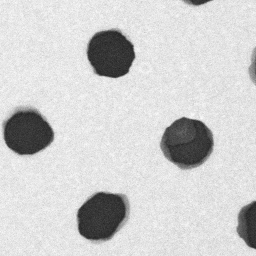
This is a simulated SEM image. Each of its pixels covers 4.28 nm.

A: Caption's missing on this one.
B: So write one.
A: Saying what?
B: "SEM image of holes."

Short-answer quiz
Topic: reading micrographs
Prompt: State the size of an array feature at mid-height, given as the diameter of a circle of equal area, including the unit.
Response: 202 nm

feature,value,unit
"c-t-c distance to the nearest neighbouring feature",480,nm